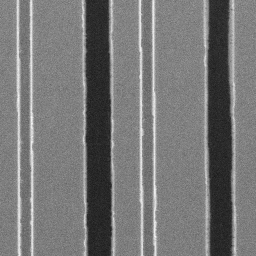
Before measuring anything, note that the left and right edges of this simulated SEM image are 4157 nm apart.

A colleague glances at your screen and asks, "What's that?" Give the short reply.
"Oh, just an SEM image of lines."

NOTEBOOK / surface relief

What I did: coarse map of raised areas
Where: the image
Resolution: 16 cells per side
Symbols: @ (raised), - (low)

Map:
@@@@@--@@@@@@--@
@@@@@--@@@@@@--@
@@@@@--@@@@@@--@
@@@@@--@@@@@@--@
@@@@@--@@@@@@--@
@@@@@--@@@@@@--@
@@@@@--@@@@@@--@
@@@@@--@@@@@@--@
@@@@@--@@@@@@--@
@@@@@--@@@@@@--@
@@@@@--@@@@@@--@
@@@@@--@@@@@@--@
@@@@@--@@@@@@--@
@@@@@--@@@@@@--@
@@@@@--@@@@@@--@
@@@@@--@@@@@@--@